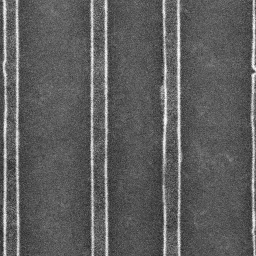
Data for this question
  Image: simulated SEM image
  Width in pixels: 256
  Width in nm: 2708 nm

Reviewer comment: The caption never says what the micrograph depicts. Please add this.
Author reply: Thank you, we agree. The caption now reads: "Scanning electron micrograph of one or a few lines or trenches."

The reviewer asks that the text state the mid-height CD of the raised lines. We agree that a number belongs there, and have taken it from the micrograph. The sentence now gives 151 nm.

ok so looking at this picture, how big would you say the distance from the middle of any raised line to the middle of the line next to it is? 850 nm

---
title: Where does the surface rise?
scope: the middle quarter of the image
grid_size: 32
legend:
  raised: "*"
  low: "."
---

.......***................***...
.......***................***...
.......***................***...
.......***................***...
.......***...............****...
.......***...............****...
.......***................***...
.......***................***...
.......***................***...
.......***................***...
.......***................***...
.......***................***...
.......***................***...
.......***................***...
.......***...............****...
.......***...............****...
.......***...............****...
.......***...............****...
.......***...............****...
.......***...............****...
.......***...............****...
.......***...............****...
.......***...............****...
.......***...............****...
.......***...............****...
.......***...............****...
.......***...............****...
.......***...............****...
.......***...............****...
.......***...............****...
.......***...............****...
.......***...............****...